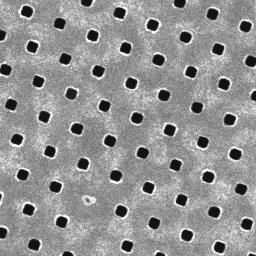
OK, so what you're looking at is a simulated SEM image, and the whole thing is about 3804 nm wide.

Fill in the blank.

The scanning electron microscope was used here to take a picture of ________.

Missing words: a regular array of holes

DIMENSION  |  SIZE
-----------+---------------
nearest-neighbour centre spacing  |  519 nm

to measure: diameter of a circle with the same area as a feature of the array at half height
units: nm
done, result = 181